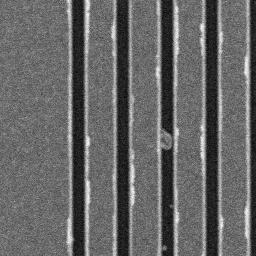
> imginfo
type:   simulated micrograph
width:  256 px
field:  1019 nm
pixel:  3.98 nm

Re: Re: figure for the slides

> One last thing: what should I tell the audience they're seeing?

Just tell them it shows parallel lines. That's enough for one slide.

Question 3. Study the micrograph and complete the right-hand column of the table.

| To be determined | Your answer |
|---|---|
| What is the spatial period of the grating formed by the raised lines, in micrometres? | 0.177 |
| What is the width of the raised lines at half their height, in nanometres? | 116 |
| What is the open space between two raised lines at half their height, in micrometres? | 0.0618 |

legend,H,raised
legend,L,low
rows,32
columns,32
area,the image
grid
HHHHHHHHHLLHHHLLHHHHLLHHHLLLHHHL
HHHHHHHHHLLHHHLLHHHHLLHHHLLLHHHL
HHHHHHHHHLLHHHLLHHHHLLHHHLLLHHHL
HHHHHHHHHLLHHHLLHHHHLLHHHLLLHHHL
HHHHHHHHHLLHHHLLHHHHLLHHHLLLHHHL
HHHHHHHHHLLHHHLLHHHHLLHHHLLLHHHL
HHHHHHHHHLLHHHLLHHHHLLHHHLLLHHHL
HHHHHHHHHLLHHHLLHHHHLLHHHLLLHHHL
HHHHHHHHHLLHHHLLHHHHLLHHHLLLHHHL
HHHHHHHHHLLHHHLLHHHHLLHHHLLLHHHL
HHHHHHHHHLLHHHLLHHHHLLHHHLLLHHHL
HHHHHHHHHLLHHHLLHHHHLLHHHLLLHHHL
HHHHHHHHHLLHHHLLHHHHLLHHHLLLHHHL
HHHHHHHHHLLHHHLLHHHHLLHHHLLLHHHL
HHHHHHHHHLLHHHLLHHHHLLHHHLLLHHHL
HHHHHHHHHLLHHHLLHHHHLLHHHLLLHHHL
HHHHHHHHHLLHHHLLHHHHLLHHHLLLHHHL
HHHHHHHHHLLHHHLLHHHHLLHHHHLLHHHL
HHHHHHHHHLLHHHLLHHHHLLHHHHLLHHHL
HHHHHHHHHLLHHHLLHHHHLLHHHHLLHHHL
HHHHHHHHHLLHHHLLHHHHLLHHHHLLHHHL
HHHHHHHHHLLHHHLLHHHHLLHHHHLLHHHL
HHHHHHHHHLLHHHLLHHHHLLHHHHLLHHHL
HHHHHHHHHLLHHHLLHHHHLLHHHLLLHHHL
HHHHHHHHHLLHHHLLHHHHLLHHHLLLHHHL
HHHHHHHHHLLHHHLLHHHHLLHHHHLLHHHL
HHHHHHHHHLLHHHLLHHHHLLHHHLLLHHHL
HHHHHHHHHLLHHHLLHHHHLLHHHHLLHHHL
HHHHHHHHHLLHHHLLHHHHLLHHHHLLHHHL
HHHHHHHHHLLHHHLLHHHHLLHHHHLLHHHL
HHHHHHHHHLLHHHLLHHHHLLHHHHLLHHHL
HHHHHHHHHLLHHHLLHHHHLLHHHLLLHHHL